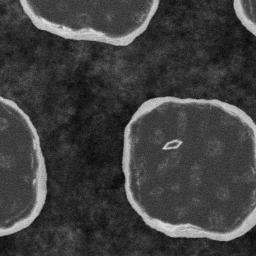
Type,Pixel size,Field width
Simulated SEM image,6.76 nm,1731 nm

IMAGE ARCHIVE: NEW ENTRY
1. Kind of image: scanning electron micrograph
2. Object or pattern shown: raised bodies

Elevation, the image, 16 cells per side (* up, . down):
..********.....*
...******......*
................
................
................
................
*........*****..
**......*******.
**......********
***.....********
***.....********
***.....********
***.....********
**.......*******
...........****.
................